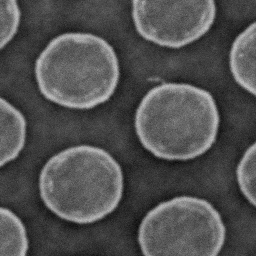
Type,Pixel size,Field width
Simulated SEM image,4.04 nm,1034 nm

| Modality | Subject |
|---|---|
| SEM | raised bodies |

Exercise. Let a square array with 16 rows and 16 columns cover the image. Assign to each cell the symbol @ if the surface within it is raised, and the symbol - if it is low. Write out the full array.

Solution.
@-------@@@@@---
@--------@@@@---
----@@----@@---@
---@@@@--------@
--@@@@@--------@
---@@@@---@@----
----@@---@@@@---
@--------@@@@---
@--------@@@@---
@---@@----@@----
---@@@@--------@
---@@@@@-------@
---@@@@----@----
@---@@---@@@@@--
@--------@@@@@--
@@-------@@@@@--